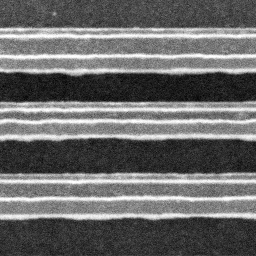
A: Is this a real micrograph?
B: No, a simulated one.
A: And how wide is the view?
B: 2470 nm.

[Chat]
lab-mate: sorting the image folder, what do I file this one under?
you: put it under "lines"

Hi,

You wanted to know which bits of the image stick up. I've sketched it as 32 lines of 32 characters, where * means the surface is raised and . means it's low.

................................
................................
................................
................................
********************************
********************************
********************************
********************************
********************************
................................
................................
................................
................................
********************************
********************************
********************************
********************************
................................
................................
................................
................................
................................
********************************
********************************
********************************
********************************
********************************
................................
................................
................................
................................
................................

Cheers